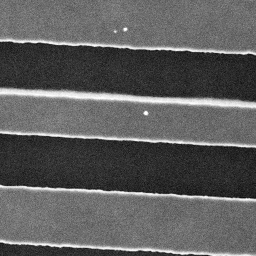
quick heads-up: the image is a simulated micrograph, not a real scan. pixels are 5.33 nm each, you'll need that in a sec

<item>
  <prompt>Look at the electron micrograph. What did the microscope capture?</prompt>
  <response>lines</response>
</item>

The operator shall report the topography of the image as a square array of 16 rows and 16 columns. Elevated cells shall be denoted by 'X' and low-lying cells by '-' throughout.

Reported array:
XXXXXXXXXXXXXXXX
XXXXXXXXXXXXXXXX
XXXXXXXXXXXXXXXX
----------------
----------------
----------------
XXXXXXXXXXXXXX--
XXXXXXXXXXXXXXXX
---XXXXXXXXXXXXX
----------------
----------------
----------------
XXXXXXXXXXXXXXXX
XXXXXXXXXXXXXXXX
XXXXXXXXXXXXXXXX
------XXXXXXXXXX